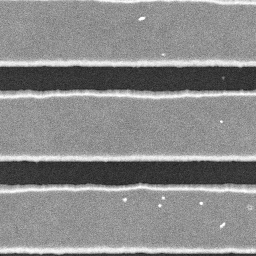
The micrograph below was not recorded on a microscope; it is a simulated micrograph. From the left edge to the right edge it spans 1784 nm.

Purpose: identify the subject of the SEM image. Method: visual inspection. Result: lines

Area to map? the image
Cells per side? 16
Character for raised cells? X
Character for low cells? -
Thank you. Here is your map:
XXXXXXXXXXXXXXXX
XXXXXXXXXXXXXXXX
XXXXXXXXXXXXXXXX
XXXXXXXXXXXXXXXX
----------------
----------------
XXXXXXXXXXXXXXXX
XXXXXXXXXXXXXXXX
XXXXXXXXXXXXXXXX
XXXXXXXXXXXXXXXX
----------------
----------------
XXXXXXXXXXXXXXXX
XXXXXXXXXXXXXXXX
XXXXXXXXXXXXXXXX
XXXXXXXXXXXXXXXX